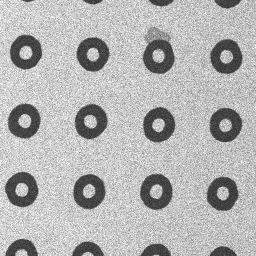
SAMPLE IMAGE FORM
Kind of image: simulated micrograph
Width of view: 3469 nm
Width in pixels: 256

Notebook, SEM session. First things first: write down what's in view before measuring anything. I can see a regular array of ring-shaped grooves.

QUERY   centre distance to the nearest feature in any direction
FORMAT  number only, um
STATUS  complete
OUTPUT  0.906